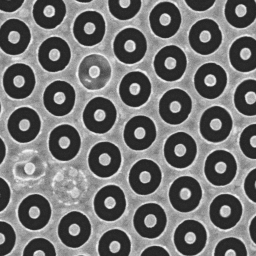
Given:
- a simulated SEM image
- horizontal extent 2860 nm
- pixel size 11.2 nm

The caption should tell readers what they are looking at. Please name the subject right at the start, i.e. a regular array of ring-shaped grooves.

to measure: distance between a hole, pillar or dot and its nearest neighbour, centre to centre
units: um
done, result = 0.487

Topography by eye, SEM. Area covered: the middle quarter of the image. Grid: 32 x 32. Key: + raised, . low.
.+++++++++++++++++++++...+++...+
+++++++++++++++++++++++.......++
++++++++++++++++....+++.......++
+++++++++++++++......+++.....+++
.+++++++++++++........++++++++++
..++++++++++++...++...++++++++++
...+++++++++++..+++...++++....++
...+++++++++++...+....+++......+
...++++...++++.......+++........
...+++......+++......+++...++...
..+++........+++...+++++...++...
..+++...+....+++++++++++...++...
.++++...++...+++++++++++.......+
+++++...++...++++....+++.......+
+++++........+++......+++.....++
..+++.......+++........+++++++++
...+++.....++++...++...+++++++++
....+++++++++++...++...++++....+
+...+++++++++++...+....+++......
+...+++++..++++.......+++.......
+...+++......+++......+++...++..
....+++.......+++...+++++...++..
...+++........+++++++++++...++..
..++++...++...+++++++++++.......
++++++...++...++++.....+++......
++++++........+++.......+++....+
+++++++......++++.......++++++++
++++++++.....+++...++...++++++++
++++++++++++++++...+++..++++....
++++++++++++++++....+...+++.....
++++++++++...++++.......+++.....
+++++++++......++......+++...++.